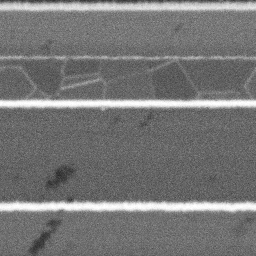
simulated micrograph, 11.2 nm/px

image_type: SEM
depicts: lines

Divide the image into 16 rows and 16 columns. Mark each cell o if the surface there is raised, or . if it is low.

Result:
oooooooooooooooo
oooooooooooooooo
oooooooooooooooo
oooooooooooooooo
oooooooooooooooo
oooooooooooooooo
................
................
................
................
................
................
................
oooooooooooooooo
oooooooooooooooo
oooooooooooooooo